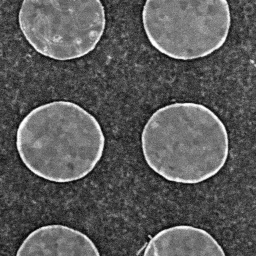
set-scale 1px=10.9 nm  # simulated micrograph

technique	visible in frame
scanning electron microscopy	raised bodies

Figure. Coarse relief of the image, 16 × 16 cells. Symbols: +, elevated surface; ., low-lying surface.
.+++++...+++++..
.+++++...+++++..
..++++...+++++..
...++......++...
................
................
...+............
..++++...+++++..
.+++++...+++++..
.+++++...+++++..
..++++....++++..
................
................
................
..+++.....+++...
.+++++...+++++..